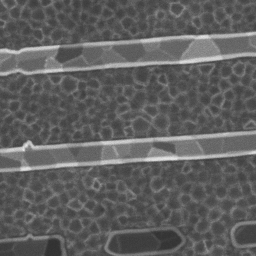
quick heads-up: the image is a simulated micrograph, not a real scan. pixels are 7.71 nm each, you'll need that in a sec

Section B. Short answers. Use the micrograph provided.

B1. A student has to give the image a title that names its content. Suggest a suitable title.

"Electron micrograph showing one or a few lines or trenches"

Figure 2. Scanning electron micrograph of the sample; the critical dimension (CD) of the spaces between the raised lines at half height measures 578 nm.